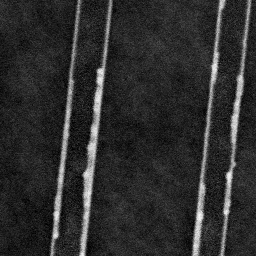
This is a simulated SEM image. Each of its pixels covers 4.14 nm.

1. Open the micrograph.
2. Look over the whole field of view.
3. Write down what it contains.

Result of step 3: one or a few lines or trenches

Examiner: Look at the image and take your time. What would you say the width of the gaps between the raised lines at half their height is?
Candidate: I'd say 0.449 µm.